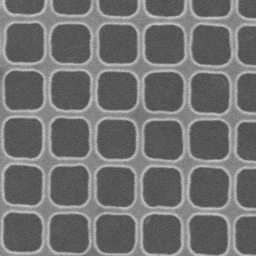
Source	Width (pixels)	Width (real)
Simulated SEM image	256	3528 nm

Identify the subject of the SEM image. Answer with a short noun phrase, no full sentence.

a regular array of holes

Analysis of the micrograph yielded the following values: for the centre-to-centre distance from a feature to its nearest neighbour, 46.3 pixels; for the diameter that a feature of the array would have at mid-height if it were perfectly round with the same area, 598 nanometers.